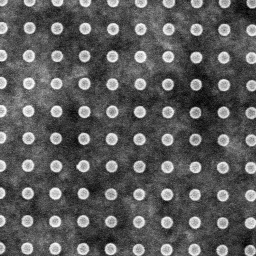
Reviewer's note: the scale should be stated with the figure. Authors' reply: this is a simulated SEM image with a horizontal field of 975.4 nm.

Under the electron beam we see a regular array of raised bodies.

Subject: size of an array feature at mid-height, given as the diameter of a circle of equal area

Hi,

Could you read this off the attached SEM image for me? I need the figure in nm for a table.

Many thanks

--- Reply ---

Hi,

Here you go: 42.4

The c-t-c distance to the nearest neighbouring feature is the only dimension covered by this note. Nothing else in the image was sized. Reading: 104 nanometers